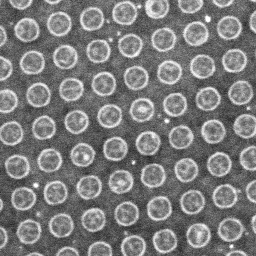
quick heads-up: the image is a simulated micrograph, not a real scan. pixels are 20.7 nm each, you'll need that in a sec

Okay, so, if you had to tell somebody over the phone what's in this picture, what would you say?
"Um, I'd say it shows a regular array of raised bodies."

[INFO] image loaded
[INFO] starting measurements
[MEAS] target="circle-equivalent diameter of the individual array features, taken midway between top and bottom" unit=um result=0.463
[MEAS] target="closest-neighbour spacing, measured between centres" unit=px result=32.7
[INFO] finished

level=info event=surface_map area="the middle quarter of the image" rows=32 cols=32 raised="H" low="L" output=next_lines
HHLLLLLLLLLLLLLLLLLLLLLLHHHHHLLL
LLLLLLLLLLLLLLLLHHHHLLLLHHHHHLLL
LLLLLLLLLHHLLLLHHHHHHLLLHHHHHLLL
LLLLLLLLHHHHLLLHHHHHHLLLHHHHHLLL
HHHHLLLHHHHHHLLHHHHHHLLLLHHHLLLL
HHHHHLLHHHHHHLLLHHHHLLLLLLLLLLLL
HHHHHLLLHHHHLLLLLLLLLLLLLLLLLLLL
HHHHLLLLLHHLLLLLLLLLLLLLLLLLLLLL
HHHLLLLLLLLLLLLLLLLLLLLLLLHHHHLL
LLLLLLLLLLLLLLLLLLHHHLLLLHHHHHLL
LLLLLLLLLLLHHLLLLHHHHHLLLHHHHHLL
LLLLLLLLLHHHHHLLLHHHHHLLLHHHHHLL
LHHHHLLLLHHHHHLLLHHHHHLLLLLHHLLL
LHHHHHLLLHHHHHLLLHHHHLLLLLLLLLLL
HHHHHHLLLHHHHHLLLLLLLLLLLLLLLLLL
LHHHHHLLLLHHLLLLLLLLLLLLLLLLLLLL
LHHHHLLLLLLLLLLLLLLLLLLLLLLHHHHL
LLLLLLLLLLLLLLLLLLLLHHLLLLLHHHHH
LLLLLLLLLLLLLLLLLLLHHHHHLLHHHHHH
LLLLLLLLLLLHHHHLLLHHHHHHLLLHHHHH
LLLHHHLLLLHHHHHLLLHHHHHHLLLHHHHL
LLHHHHHLLLHHHHHHLLLHHHHLLLLLLLLL
LLHHHHHHLLHHHHHLLLLLHHLLLLLLLLLL
LLHHHHHLLLLHHHHLLLLLLLLLLLLLLLLL
LLHHHHHLLLLLLLLLLLLLLLLLLLLLLHHH
LLLLLLLLLLLLLLLLLLLLLHHHLLLLHHHH
LLLLLLLLLLLLLLLLLLLLHHHHHLLLHHHH
LLLLLLLLLLLLHHHHLLLLHHHHHLLLHHHH
LLLLLHHHLLLLHHHHHLLLHHHHHLLLLHHH
LLLLHHHHHLLHHHHHHLLLHHHHHLLLLLLL
LLLHHHHHHLLLHHHHHLLLLHHLLLLLLLLL
LLLLHHHHHLLLHHHHLLLLLLLLLLLLLLLL